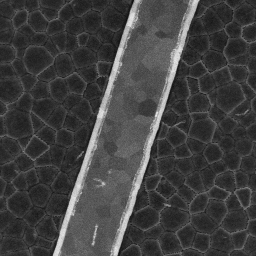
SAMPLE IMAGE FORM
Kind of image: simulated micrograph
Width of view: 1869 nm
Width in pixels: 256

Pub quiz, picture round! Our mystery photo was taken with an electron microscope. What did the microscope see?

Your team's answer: one or a few lines or trenches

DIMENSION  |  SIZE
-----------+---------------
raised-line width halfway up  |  57.8 pixels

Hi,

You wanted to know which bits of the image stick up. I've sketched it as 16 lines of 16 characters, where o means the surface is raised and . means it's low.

........oooo....
........oooo....
........ooo.....
.......oooo.....
.......oooo.....
.......oooo.....
......oooo......
......oooo......
......oooo......
.....oooo.......
.....oooo.......
.....oooo.......
.....ooo........
....oooo........
....oooo........
....ooo.........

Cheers